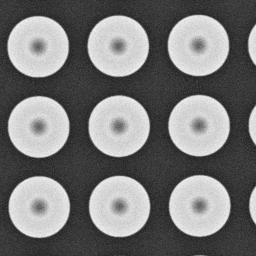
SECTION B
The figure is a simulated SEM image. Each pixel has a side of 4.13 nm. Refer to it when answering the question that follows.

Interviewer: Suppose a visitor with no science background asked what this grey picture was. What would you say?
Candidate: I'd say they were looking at an array of small figures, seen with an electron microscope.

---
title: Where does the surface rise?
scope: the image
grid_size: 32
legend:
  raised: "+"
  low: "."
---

................................
................................
...++++......++++......++++.....
..++++++....++++++....++++++....
.+++++++...+++++++...+++++++...+
.++++++++..++++++++..++++++++..+
.++++++++..++++++++..++++++++..+
.+++++++...+++++++...+++++++....
..+++++.....+++++.....+++++.....
....++........++................
................................
................................
...++++......++++......++++.....
..++++++....++++++....++++++....
.+++++++...+++++++...++++++++..+
.++++++++..++++++++..++++++++..+
.++++++++..++++++++..++++++++..+
.+++++++...+++++++....++++++....
..++++++....++++++....+++++.....
....++........++................
................................
................................
...++++......++++......++++.....
..++++++....++++++....++++++....
.+++++++...+++++++...++++++++..+
.++++++++..++++++++..++++++++..+
.++++++++..++++++++..++++++++..+
.+++++++....++++++....++++++....
..++++++....++++++....++++++....
....++........++........+.......
................................
................................